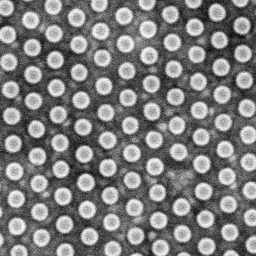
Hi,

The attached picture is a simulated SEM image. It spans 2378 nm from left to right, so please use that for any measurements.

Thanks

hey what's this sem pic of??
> a regular array of raised bodies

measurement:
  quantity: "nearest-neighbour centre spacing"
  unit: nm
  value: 247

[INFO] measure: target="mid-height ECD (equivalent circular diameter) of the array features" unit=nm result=144